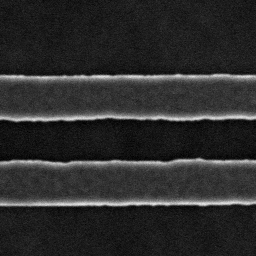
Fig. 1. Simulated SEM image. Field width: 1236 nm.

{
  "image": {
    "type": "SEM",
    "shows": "lines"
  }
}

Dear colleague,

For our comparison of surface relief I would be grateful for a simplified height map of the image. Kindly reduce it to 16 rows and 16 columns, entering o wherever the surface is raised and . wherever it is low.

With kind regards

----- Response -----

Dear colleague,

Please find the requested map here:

................
................
................
................
................
oooooooooooooooo
oooooooooooooooo
ooooo.....oo....
................
................
oooooooooooooooo
oooooooooooooooo
oooooooooooooooo
................
................
................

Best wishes